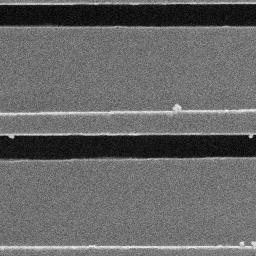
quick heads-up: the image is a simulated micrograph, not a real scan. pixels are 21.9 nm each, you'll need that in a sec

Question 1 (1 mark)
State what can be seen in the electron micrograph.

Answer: lines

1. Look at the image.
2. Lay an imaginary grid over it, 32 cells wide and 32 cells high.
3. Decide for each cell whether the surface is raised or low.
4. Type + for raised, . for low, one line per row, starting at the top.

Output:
++++++++++.++.++++..+...........
................................
................................
++++++++++++++++++++++++++++++++
++++++++++++++++++++++++++++++++
++++++++++++++++++++++++++++++++
++++++++++++++++++++++++++++++++
++++++++++++++++++++++++++++++++
++++++++++++++++++++++++++++++++
++++++++++++++++++++++++++++++++
++++++++++++++++++++++++++++++++
++++++++++++++++++++++++++++++++
++++++++++++++++++++++++++++++++
++++++++++++++++++++++++++++++++
++++++++++++++++++++++++++++++++
++++++++++++++++++++++++++++++++
++++++++++++++++++++++++++++++++
................................
................................
................................
++++++++++++++++++++++++++++++++
++++++++++++++++++++++++++++++++
++++++++++++++++++++++++++++++++
++++++++++++++++++++++++++++++++
++++++++++++++++++++++++++++++++
++++++++++++++++++++++++++++++++
++++++++++++++++++++++++++++++++
++++++++++++++++++++++++++++++++
++++++++++++++++++++++++++++++++
++++++++++++++++++++++++++++++++
++++++++++++++++++++++++++++++++
++++++++++++++++++++++++++++++++